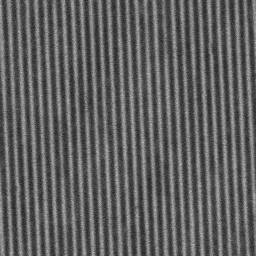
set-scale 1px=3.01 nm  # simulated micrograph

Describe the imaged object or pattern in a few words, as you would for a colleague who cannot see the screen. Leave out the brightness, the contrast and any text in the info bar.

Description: parallel lines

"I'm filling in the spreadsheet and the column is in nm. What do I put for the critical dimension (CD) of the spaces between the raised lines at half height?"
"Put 18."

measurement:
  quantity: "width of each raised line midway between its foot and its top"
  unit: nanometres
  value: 10.1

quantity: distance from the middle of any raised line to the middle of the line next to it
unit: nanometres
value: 27.3